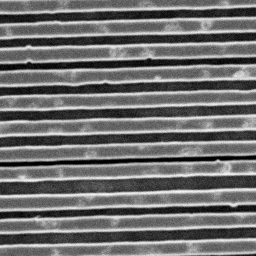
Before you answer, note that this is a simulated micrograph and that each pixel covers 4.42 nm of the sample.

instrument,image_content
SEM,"parallel lines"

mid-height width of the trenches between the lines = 45.3 nm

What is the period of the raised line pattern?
24.5 pixels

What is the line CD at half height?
63.5 nm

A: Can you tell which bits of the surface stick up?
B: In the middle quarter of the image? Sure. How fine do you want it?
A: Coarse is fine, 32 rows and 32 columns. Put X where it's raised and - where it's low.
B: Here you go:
--------------------------------
---XXXXXXXXXXXXXXXXXXXXXXXXXXXXX
XXXXXXXXXXXXXXXXXXXXXXXXXXXXXXXX
XXXXXXXXXXXXXXXXXXXXXXXXXXXXXXXX
XXXXXXXXXXXXXXXXX---------------
--------------------------------
--------------------------------
------------XX----XXXXXXXXXXXXXX
XXXXXXXXXXXXXXXXXXXXXXXXXXXXXXXX
XXXXXXXXXXXXXXXXXXXXXXXXXXXXXXXX
XXXXXXXXXXXXXXXXXXXXXXXXX-------
--------------------------------
--------------------------------
--------------------------------
XXXXXXXXXXXXXXXXXXXXXXXXXXXXXXXX
XXXXXXXXXXXXXXXXXXXXXXXXXXXXXXXX
XXXXXXXXXXXXXXXXXXXXXXXXXXXXXXXX
X--XX---------------------------
--------------------------------
--------------------------------
-XXXXXXXXXXXXXXXXXXXXXXXXXXXXXXX
XXXXXXXXXXXXXXXXXXXXXXXXXXXXXXXX
XXXXXXXXXXXXXXXXXXXXXXXXXXXXXXXX
XXXXXXXXXXXXXX------------------
--------------------------------
XXX-XXXXXXXXXXXXXXXXXXXXXXXXXXXX
XXXXXXXXXXXXXXXXXXXXXXXXXXXXXXXX
XXXXXXXXXXXXXXXXXXXXXXXXXXXXXXXX
XXXXXXXXXX-XXX------------------
--------------------------------
--------------------------------
--------------------------------